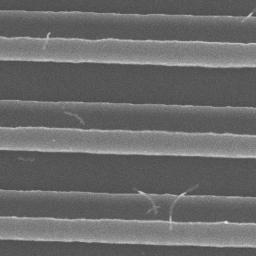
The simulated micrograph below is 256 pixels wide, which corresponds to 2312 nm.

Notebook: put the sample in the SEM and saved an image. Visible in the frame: lines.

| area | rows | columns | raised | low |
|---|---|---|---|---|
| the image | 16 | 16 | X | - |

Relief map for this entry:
----------------
XXXXXXXXXXXXXXXX
XXXXXXXXXXXXXXXX
XXXXXXXXXXXXXXXX
----------------
----------------
XXXXXXX---------
XXXXXXXXXXXXXXXX
XXXXXXXXXXXXXXXX
-----XXXXXXXXXXX
----------------
----------------
XXXXXXXXXXXXXXXX
XXXXXXXXXXXXXXXX
XXXXXXXXXXXXXXXX
----------------